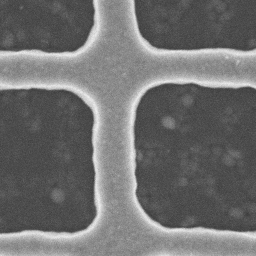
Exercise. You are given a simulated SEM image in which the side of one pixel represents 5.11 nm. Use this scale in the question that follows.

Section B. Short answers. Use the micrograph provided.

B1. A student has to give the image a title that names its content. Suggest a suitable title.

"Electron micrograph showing holes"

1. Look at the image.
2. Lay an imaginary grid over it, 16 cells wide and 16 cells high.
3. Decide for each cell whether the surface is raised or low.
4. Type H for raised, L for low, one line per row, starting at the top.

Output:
LLLLLLHHLLLLLLLL
LLLLLLHHHLLLLLLL
LLLLLLHHHLLLLLLL
HHHHHHHHHHHHHHHH
HHHHHHHHHHHHHHHH
LLLLHHHHHLLLLLLL
LLLLLLHHHLLLLLLL
LLLLLLHHLLLLLLLL
LLLLLLHHLLLLLLLL
LLLLLLHHLLLLLLLL
LLLLLLHHLLLLLLLL
LLLLLLHHHLLLLLLL
LLLLLLHHHLLLLLLL
LLLLLLHHHLLLLLLL
LLLLLHHHHHHHHHHL
HHHHHHHHHHHHHHHH